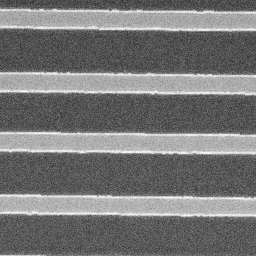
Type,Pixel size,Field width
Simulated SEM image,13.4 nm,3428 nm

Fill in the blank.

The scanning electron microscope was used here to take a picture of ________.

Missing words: lines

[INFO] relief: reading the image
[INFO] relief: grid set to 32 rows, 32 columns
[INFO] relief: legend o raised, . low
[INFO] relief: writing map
................................
ooooooooooooooooooooooooooo.....
oooooooooooooooooooooooooooooooo
....oooooooooooooooooooooooooooo
................................
................................
................................
................................
................................
oooooooooooooooooooooooooooooooo
oooooooooooooooooooooooooooooooo
..........oo.ooooooooooooooooooo
................................
................................
................................
................................
................................
oooooooooooooooooooooooooooooooo
oooooooooooooooooooooooooooooooo
................................
................................
................................
................................
................................
ooooo...........................
oooooooooooooooooooooooooooooooo
oooooooooooooooooooooooooooooooo
................................
................................
................................
................................
................................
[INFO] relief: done